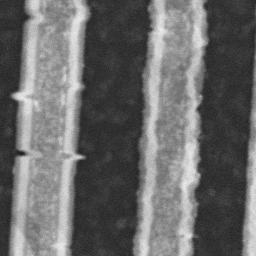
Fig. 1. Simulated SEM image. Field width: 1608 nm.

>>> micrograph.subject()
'one or a few lines or trenches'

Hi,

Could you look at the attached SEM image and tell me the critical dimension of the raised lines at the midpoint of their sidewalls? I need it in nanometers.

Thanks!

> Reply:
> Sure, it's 259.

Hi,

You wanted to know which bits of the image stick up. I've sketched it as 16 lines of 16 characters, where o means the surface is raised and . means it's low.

..ooo.....oo....
..ooo.....oo....
..ooo.....oo....
..ooo.....oo....
..ooo.....oo....
..ooo.....oo....
..oo......oo....
..oo......oo....
..oo.....ooo....
..oo.....ooo....
..oo.....ooo....
.ooo.....ooo....
.ooo.....ooo....
.ooo.....ooo....
.ooo.....ooo....
.ooo.....ooo....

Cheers